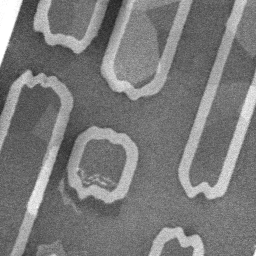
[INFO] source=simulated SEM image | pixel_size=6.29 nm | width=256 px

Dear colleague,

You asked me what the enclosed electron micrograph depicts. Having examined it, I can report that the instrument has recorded one or a few lines or trenches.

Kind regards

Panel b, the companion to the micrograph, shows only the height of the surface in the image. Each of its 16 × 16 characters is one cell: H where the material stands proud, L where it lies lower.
HLLHHHLLHHHLLLLH
HLLHHHLLHHHLLLLH
LLLLHLLHHHHLLLHH
LLLLLLLHHHLLLLHH
LLLLLLLHHHLLLLHH
LHHHLLLLHLLLLHHH
LHHHLLLLLLLLLHHH
HHHHLLLLLLLLLHHL
HHHHLHHLLLLLHHHL
HHHLLHHHLLLLHHHL
HHHLLHHHLLLLHHLL
HHHLLHHHLLLLHHLL
HHLLLLLLLLLLLLLL
HHLLLLLLLLLLLLLL
HHLLLLLLLLLLLLLL
HLLLLLLLLLHHLLLL